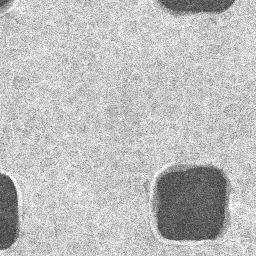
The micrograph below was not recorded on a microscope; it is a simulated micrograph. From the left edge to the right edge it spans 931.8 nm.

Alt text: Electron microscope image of holes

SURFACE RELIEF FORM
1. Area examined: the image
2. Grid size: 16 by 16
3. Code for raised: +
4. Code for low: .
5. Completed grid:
++++++++++....++
++++++++++++++++
++++++++++++++++
++++++++++++++++
++++++++++++++++
++++++++++++++++
++++++++++++++++
++++++++++++++++
++++++++++++++++
++++++++++++++++
+++++++++++...++
.+++++++++....++
.+++++++++....++
.+++++++++....++
.+++++++++....++
++++++++++++++++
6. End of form